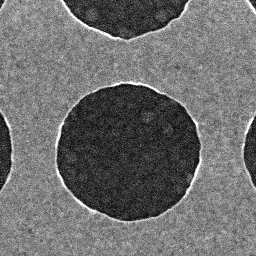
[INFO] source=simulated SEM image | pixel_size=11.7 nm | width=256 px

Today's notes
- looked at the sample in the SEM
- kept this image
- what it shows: holes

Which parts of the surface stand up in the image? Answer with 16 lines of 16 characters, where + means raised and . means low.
++++........++++
++++++....++++++
++++++++++++++++
++++++++++++++++
++++++++++++++++
++++++...+++++++
+++++......+++++
++++........++++
.+++........+++.
.+++.........++.
.+++........+++.
++++........++++
+++++......+++++
+++++++...++++++
++++++++++++++++
++++++++++++++++